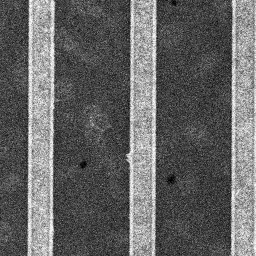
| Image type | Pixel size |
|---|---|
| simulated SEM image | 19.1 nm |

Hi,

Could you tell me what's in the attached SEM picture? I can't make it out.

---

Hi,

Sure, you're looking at one or a few lines or trenches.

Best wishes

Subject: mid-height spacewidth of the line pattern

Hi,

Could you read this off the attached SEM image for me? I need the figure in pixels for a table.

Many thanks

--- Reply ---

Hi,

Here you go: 79.5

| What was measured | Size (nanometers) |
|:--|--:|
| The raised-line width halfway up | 422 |